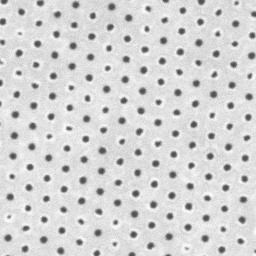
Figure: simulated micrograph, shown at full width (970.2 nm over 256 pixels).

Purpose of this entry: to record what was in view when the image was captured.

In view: a regular array of holes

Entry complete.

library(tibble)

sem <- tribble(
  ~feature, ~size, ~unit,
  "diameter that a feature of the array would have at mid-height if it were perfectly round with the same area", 26.2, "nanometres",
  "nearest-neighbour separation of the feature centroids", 0.0763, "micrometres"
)